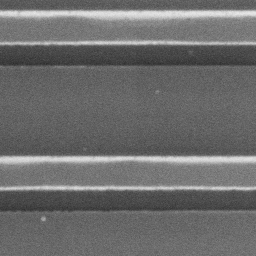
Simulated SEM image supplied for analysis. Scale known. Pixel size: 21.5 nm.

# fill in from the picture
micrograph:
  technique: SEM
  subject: lines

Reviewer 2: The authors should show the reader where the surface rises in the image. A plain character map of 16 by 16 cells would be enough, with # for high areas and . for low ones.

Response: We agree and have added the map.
................
################
################
................
................
................
................
................
................
................
################
################
................
................
................
................